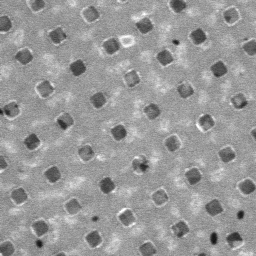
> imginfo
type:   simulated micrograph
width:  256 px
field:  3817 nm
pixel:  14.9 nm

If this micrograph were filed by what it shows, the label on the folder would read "a regular array of raised bodies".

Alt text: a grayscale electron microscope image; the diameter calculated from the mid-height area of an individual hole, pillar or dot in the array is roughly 0.265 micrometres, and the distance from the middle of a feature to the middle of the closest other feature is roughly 0.567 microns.